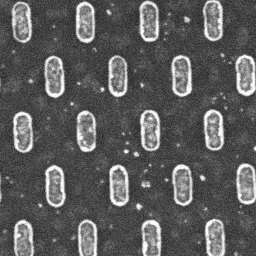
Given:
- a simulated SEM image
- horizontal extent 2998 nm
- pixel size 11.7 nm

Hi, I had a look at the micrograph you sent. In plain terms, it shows a regular array of raised bodies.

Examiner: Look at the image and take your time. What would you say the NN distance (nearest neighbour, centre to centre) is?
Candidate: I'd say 738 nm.